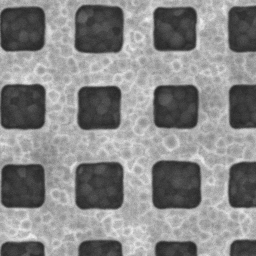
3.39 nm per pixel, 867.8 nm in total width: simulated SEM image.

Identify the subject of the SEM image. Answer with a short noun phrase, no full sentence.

holes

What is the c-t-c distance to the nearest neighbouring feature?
0.26 µm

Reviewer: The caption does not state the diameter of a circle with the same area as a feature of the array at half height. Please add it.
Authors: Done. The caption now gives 177 nanometres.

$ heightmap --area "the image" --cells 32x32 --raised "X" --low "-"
XXXXXXXXXXXX-XXXXXXXXXXXXXXXXXXX
------XXXX-----XXXX------XXXX---
------XXX-------XXX------XXX----
------XXX------XXXX------XXX----
------XXX------XXXX------XXX----
------XXX------XXXX------XXXX---
XXXXXXXXXX-----XXXXX--XXXXXXXX-X
XXXXXXXXXXXXXXXXXXXXXXXXXXXXXXXX
XXXXXXXXXXXXXXXXXXXXXXXXXXXXXXXX
XXXXXXXXXXXXXXXXXXXXXXXXXXXXXXXX
X--X-XXXXXXXXXXXXXXXXX--XXXXXX--
------XXXX-----XXXX------XXXX---
------XXXX-----XXXX------XXXX---
------XXXX-----XXXX------XXXX---
------XXXX-----XXXX------XXXX---
------XXXX-----XXXX------XXXX---
XXXXXXXXXXXXXXXXXXXXXXXXXXXXXXXX
XXXXXXXXXXXXXXXXXXXXXXXXXXXXXXXX
XXXXXXXXXXXXXXXXXXXXXXXXXXXXXXXX
XXXXXXXXXXXXXXXXXXXXXXXXXXXXXXXX
X----XXXXX-----XXXX------XXXX---
------XXX-------XXX------XXXX---
------XXX-------XXX------XXXX---
------XXX-------XXX------XXX----
------XXX-------XXX------XXX----
-----XXXX------XXXX------XXXX---
XXXXXXXXXXXXXXXXXXXXXXXXXXXXXXXX
XXXXXXXXXXXXXXXXXXXXXXXXXXXXXXXX
XXXXXXXXXXXXXXXXXXXXXXXXXXXXXXXX
XXXXXXXXXXXXXXXXXXXXXXXXXXXXXXXX
-----XXXXX-----XXXXX-----XXXX---
------XXXX-----XXXX------XXXX---